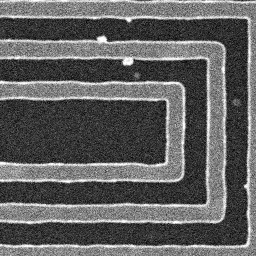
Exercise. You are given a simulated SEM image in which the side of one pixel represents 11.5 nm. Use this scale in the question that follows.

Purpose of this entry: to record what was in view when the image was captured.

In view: groups of lines, slits or small figures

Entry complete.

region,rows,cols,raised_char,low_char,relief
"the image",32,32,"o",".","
oooooooooooooooooooooooooooooooo
oooooooooooooooooooooooooooooooo
...............................o
...............................o
...............................o
oooooooooooooooooooooooooooo...o
oooooooooooooooooooooooooooo...o
...............oo.........oo...o
..........................oo...o
..........................oo...o
oooooooooooooooooooooo....oo...o
ooooooooooooooooooooooo...oo...o
....................ooo...oo...o
.....................oo...oo...o
.....................oo...oo...o
.....................oo...oo...o
.....................oo...oo...o
.....................oo...oo...o
.....................oo...oo...o
.....................oo...oo...o
oo..............o...ooo...oo...o
ooooooooooooooooooooooo...oo...o
ooooooooooooooo.oooooo....oo...o
..........................oo...o
..........................oo...o
..........................oo...o
oooooooooooooooooooooooooooo...o
oooooooooooooooooooooooooooo...o
...............................o
...............................o
...............................o
oooooooooooooooooooooooooooooooo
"